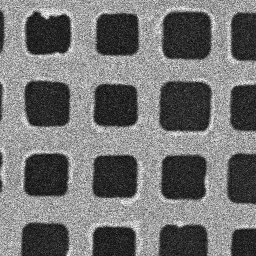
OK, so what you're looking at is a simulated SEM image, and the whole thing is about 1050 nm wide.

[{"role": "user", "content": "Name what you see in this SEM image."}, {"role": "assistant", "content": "a regular array of holes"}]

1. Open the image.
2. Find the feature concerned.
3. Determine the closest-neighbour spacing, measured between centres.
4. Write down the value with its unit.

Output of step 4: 0.282 microns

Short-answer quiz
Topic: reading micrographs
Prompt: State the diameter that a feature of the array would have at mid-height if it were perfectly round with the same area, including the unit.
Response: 196 nm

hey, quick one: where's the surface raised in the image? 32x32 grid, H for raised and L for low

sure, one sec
HHHHHHHHHHHHHHHHHHHHHHHHHHHHHHHH
HHHHHHHHHHHHHHHHHHHHHHLLLHHHHHHH
LHHLLLLLLHHHLLLLLHHHLLLLLLHHHLLL
LHHLLLLLLHHHLLLLLHHHLLLLLLHHHLLL
LHHLLLLLLHHHLLLLLHHHLLLLLLHHHLLL
HHHLLLLLLHHHLLLLLHHHLLLLLLHHHLLL
HHHHLLLLHHHHLLLLLHHHLLLLLLHHHLLL
HHHHHHHHHHHHHHHHHHHHHHHHHHHHHHLL
HHHHHHHHHHHHHHHHHHHHHHHHHHHHHHHH
HHHHHHHHHHHHHHHHHHHHHHHHHHHHHHHH
HHHLLLLLHHHHHLHHHHHHHLLLLLHHHHHH
HHHLLLLLLHHHLLLLLHHHLLLLLLHHHLLL
HHHLLLLLLHHHLLLLLHHHLLLLLLHHHLLL
HHHLLLLLLHHHLLLLLHHHLLLLLLHHHLLL
HHHLLLLLLHHHLLLLLHHHLLLLLLHHHLLL
HHHHLLLLHHHHLLLLLHHHLLLLLLHHHLLL
HHHHHHHHHHHHHHHHHHHHHHHHHHHHHHHH
HHHHHHHHHHHHHHHHHHHHHHHHHHHHHHHH
HHHHHHHHHHHHHHHHHHHHHHHHHHHHHHHH
HHHHLLLLHHHHLLLLHHHHHLLLLHHHHLLL
HHHLLLLLLHHHLLLLLHHHLLLLLLHHHLLL
HHHLLLLLLHHHLLLLLHHHLLLLLLHHLLLL
HHHLLLLLLHHHLLLLLHHHLLLLLLHHLLLL
HHHLLLLLHHHHLLLLLHHHLLLLLLHHLLLL
HHHHLLLLHHHHLLLLLHHHHLLLLHHHLLLL
HHHHHHHHHHHHHHHHHHHHHHHHHHHHHHHH
HHHHHHHHHHHHHHHHHHHHHHHHHHHHHHHH
HHHHHHHHHHHHHHHHHHHHHHHHHHHHHHHH
HHHLLLLLHHHHLLLLHHHHLLLLLLHHHHHH
HHHLLLLLLHHHLLLLLHHHLLLLLLHHHLLL
HHHLLLLLLHHHLLLLLHHHLLLLLLHHHLLL
HHHLLLLLHHHHLLLLLHHHLLLLLLHHHLLL